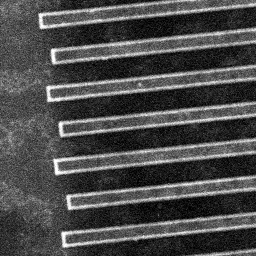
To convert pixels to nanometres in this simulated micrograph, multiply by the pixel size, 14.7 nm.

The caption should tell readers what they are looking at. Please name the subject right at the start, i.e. parallel lines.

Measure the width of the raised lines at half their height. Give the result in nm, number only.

192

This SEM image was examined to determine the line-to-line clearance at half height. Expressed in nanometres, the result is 338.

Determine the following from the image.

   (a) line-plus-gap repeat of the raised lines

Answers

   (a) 538 nm